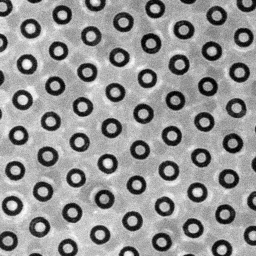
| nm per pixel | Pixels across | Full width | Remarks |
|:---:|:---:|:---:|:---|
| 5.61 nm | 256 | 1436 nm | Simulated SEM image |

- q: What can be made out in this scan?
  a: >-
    a regular array of ring-shaped grooves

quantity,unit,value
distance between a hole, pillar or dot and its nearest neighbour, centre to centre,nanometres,194